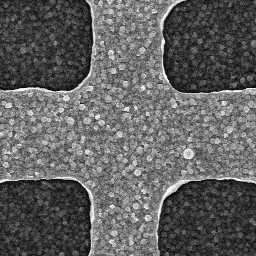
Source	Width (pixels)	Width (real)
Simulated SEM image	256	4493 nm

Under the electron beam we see holes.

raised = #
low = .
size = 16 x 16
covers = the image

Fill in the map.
......#####.....
......####......
......####......
......####......
......####......
.....######.....
################
################
################
################
################
.....######.....
......####......
......####......
......####......
......####......